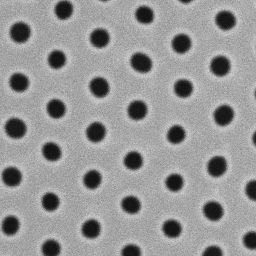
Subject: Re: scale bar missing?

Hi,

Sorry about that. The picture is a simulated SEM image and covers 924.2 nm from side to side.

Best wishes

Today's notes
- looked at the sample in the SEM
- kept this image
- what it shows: a regular array of holes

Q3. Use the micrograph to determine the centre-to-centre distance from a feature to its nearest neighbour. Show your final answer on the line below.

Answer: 161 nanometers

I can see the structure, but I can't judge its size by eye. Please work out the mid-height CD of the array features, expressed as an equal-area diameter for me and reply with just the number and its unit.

0.0672 µm